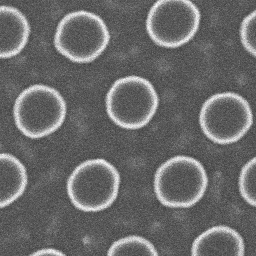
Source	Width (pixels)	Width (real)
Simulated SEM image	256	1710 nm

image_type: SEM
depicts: raised bodies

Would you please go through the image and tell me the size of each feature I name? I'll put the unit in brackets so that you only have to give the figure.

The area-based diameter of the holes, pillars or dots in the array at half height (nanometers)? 329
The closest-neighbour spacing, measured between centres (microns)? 0.553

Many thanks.